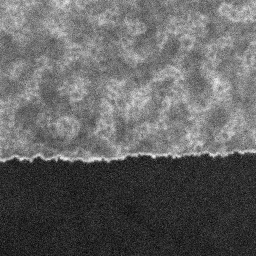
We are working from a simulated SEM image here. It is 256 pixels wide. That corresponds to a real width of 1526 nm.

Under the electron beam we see one or a few lines or trenches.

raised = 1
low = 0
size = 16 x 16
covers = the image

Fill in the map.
1111111111111111
1111111111111111
1111111111111111
1111111111111111
1111111111111111
1111111111111111
1111111111111111
1111111111111111
1111111111111111
1111111111111100
0000000000000000
0000000000000000
0000000000000000
0000000000000000
0000000000000000
0000000000000000